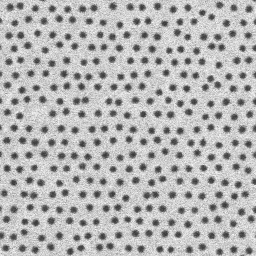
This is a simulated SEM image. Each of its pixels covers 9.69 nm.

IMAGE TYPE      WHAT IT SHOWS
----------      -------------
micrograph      a regular array of holes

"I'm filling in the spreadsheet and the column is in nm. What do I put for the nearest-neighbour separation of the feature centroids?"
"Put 123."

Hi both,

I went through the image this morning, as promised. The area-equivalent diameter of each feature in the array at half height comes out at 71.7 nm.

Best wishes